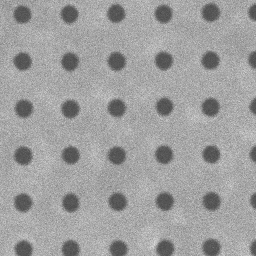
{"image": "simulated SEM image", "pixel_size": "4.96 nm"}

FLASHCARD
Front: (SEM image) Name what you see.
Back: a regular array of holes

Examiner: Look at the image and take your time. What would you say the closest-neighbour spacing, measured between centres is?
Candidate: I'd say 232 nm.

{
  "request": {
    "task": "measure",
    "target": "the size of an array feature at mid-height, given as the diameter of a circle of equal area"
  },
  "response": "92.6 nm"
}